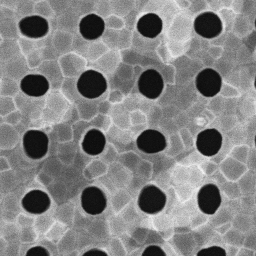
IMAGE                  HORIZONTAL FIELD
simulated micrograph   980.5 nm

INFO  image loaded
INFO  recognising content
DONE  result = a regular array of holes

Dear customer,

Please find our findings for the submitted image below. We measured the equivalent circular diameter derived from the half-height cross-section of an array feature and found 103 nanometres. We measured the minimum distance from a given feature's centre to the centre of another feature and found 0.22 µm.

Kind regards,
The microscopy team